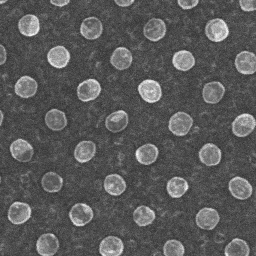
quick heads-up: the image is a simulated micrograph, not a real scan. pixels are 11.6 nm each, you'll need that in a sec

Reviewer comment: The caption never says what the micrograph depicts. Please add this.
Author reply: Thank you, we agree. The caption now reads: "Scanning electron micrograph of a regular array of raised bodies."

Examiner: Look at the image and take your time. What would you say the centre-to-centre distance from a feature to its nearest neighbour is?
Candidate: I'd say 499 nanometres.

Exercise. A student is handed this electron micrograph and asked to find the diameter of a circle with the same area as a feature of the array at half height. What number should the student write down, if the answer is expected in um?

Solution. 0.25